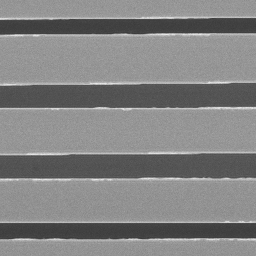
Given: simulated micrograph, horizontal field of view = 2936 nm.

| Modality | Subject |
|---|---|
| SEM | lines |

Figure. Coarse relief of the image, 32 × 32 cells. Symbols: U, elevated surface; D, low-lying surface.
UUUUUUUUUUUUUUUUUUUUUUUUUUUUUUUU
UUUUUUUUUUUUUUUUUUUUUUUUUUUUUUUU
DDDDDDDDDDDDDDDDDDDDDDDDDDDDDDDD
DDDDDDDDDDDDDDDDDDDDDDDDDDDDDDDD
UUUUUUUUUUUUUUUUUUUUUUUUUUUUUUUU
UUUUUUUUUUUUUUUUUUUUUUUUUUUUUUUU
UUUUUUUUUUUUUUUUUUUUUUUUUUUUUUUU
UUUUUUUUUUUUUUUUUUUUUUUUUUUUUUUU
UUUUUUUUUUUUUUUUUUUUUUUUUUUUUUUU
UUUUUUUUUUUUUUUUUUUUUUUUUUUUUUUU
UUUUUUUUUUUUUUUUUUDDDDDDDDDDDDDD
DDDDDDDDDDDDDDDDDDDDDDDDDDDDDDDD
DDDDDDDDDDDDDDDDDDDDDDDDDDDDDDDD
DDDDDDDDDDDUUUDDDDDDDUDDUUUUUUUU
UUUUUUUUUUUUUUUUUUUUUUUUUUUUUUUU
UUUUUUUUUUUUUUUUUUUUUUUUUUUUUUUU
UUUUUUUUUUUUUUUUUUUUUUUUUUUUUUUU
UUUUUUUUUUUUUUUUUUUUUUUUUUUUUUUU
UUUUUUUUUUUUUUUUUUUUUUUUUUUUUUUU
DDDDDDDDDDDDDDDDDDDDDDDDDDDDDDDD
DDDDDDDDDDDDDDDDDDDDDDDDDDDDDDDD
DDDDDDDDDDDDDDDDDDDDDDDDDDDDDDDD
UUUUUUUUUUUUUUUUUUUUUUUUUUUUUUUU
UUUUUUUUUUUUUUUUUUUUUUUUUUUUUUUU
UUUUUUUUUUUUUUUUUUUUUUUUUUUUUUUU
UUUUUUUUUUUUUUUUUUUUUUUUUUUUUUUU
UUUUUUUUUUUUUUUUUUUUUUUUUUUUUUUU
UUUUUUUUUUUUUUUUUUUUUUUUUUUUUUUU
DDDDDDDDDDDDDDDDDDDDDDDDDDDDDDDD
DDDDDDDDDDDDDDDDDDDDDDDDDDDDDDDD
UUUUUUUUUUUUUUUUUUUUUUUUUUUUUUUU
UUUUUUUUUUUUUUUUUUUUUUUUUUUUUUUU